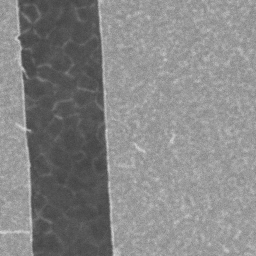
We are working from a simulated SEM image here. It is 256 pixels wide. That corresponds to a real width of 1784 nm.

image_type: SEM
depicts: one or a few lines or trenches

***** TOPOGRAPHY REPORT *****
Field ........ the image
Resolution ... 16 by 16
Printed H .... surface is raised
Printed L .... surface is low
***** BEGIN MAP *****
HLLLLLHHHHHHHHHH
HLLLLLHHHHHHHHHH
HLLLLLHHHHHHHHHH
HLLLLLHHHHHHHHHH
HLLLLLHHHHHHHHHH
HLLLLLLHHHHHHHHH
HLLLLLLHHHHHHHHH
HHLLLLLHHHHHHHHH
HHLLLLLHHHHHHHHH
HHLLLLLHHHHHHHHH
HHLLLLLHHHHHHHHH
HHLLLLLHHHHHHHHH
HHLLLLLHHHHHHHHH
HHLLLLLHHHHHHHHH
HHLLLLLHHHHHHHHH
HHLLLLLHHHHHHHHH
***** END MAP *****